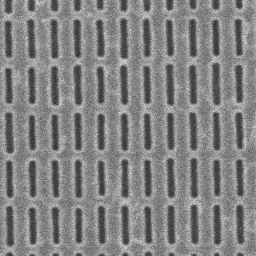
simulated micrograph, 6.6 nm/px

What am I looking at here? a regular array of holes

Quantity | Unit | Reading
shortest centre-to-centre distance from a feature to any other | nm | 150